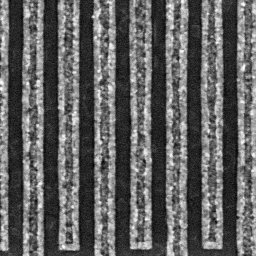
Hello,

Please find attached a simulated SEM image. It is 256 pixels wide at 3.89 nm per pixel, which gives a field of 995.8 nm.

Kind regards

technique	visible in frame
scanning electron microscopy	parallel lines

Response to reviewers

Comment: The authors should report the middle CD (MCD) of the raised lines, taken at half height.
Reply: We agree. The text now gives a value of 59.8 nanometres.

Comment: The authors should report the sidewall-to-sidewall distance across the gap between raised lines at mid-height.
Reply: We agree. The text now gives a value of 0.0783 um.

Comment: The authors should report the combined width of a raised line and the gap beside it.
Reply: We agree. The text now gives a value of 0.139 um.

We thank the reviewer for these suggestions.